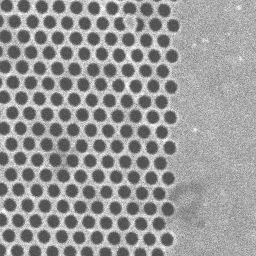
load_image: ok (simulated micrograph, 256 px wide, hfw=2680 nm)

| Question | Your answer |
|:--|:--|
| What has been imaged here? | a regular array of holes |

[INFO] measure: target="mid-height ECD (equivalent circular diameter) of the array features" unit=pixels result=13.7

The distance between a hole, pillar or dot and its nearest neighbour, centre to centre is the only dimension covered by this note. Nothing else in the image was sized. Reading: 180 nm